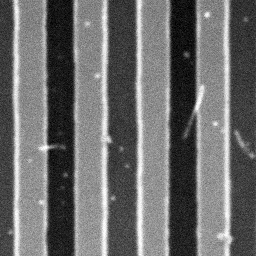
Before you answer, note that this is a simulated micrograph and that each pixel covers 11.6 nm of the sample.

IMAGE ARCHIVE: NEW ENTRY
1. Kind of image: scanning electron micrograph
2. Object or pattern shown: lines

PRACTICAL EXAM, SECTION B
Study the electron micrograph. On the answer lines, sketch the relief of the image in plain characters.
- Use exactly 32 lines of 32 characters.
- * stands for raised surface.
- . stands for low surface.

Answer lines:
..****...****....****....***....
..****...****....****....***....
..****...****....****....***....
..****...****....****....***....
..****...****....****....***....
..****...****....****....***....
..****...****....****....***....
..****...****....****....***....
..****...****....****....***....
..****...****....****....***....
..****...****....****....***....
..****...****....****....***....
..****...****.....***....***....
..****...****.....***....***....
..****...****.....***....***....
..****...****.....***....***....
..****...****.....***....***....
..****...*****....***....***....
..****...****.....***....***....
..****...****.....***....***....
..****...****.....***....***....
..****...****.....***....***....
..****...****.....***....***....
..****...****.....***....***....
..****...****.....***....***....
..****...****.....***....***....
..****...****.....***....***....
..****...****.....***....***....
..****...****.....***....***....
..****...****.....***....****...
..****...****.....***....****...
..****...****.....***....****...